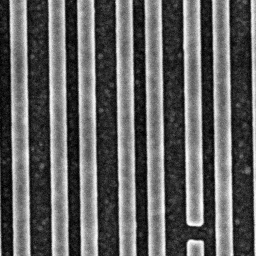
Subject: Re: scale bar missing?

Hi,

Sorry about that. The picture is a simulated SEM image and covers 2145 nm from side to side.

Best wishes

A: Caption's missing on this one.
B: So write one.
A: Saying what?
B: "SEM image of parallel lines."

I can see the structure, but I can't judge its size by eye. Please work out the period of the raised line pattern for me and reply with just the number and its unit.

283 nm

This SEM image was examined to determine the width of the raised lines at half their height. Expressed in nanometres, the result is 134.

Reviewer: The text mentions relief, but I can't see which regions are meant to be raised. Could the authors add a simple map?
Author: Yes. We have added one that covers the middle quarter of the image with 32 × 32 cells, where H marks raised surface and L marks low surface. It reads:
LLLLHHHHLLLLLHHHHLLLLHHHLLLLLLHH
LLLLHHHLLLLLLHHHHLLLLHHHHLLLLLHH
LLLLHHHHLLLLLHHHHLLLLHHHLLLLLLHH
LLLLHHHHLLLLLHHHHLLLLHHHHLLLLLHH
LLLLHHHHLLLLLHHHHLLLLHHHHLLLLLHH
LLLLHHHHLLLLLLHHHLLLLHHHHLLLLLHH
LLLLHHHHLLLLLLHHHLLLLHHHHLLLLLHH
LLLLHHHHLLLLLLHHHLLLLHHHHLLLLLHH
LLLLHHHHLLLLLLHHHLLLLHHHLLLLLLHH
LLLLHHHHLLLLLLHHHLLLLHHHHLLLLLHH
LLLLHHHHLLLLLLHHHLLLLHHHLLLLLLHH
LLLLHHHHLLLLLLHHHLLLLHHHLLLLLLHH
LLLLHHHHLLLLLLHHHLLLLHHHLLLLLLLH
HLLLHHHHLLLLLHHHHLLLLHHHHLLLLLLH
HLLLHHHHLLLLLLHHHLLLLHHHHLLLLLLH
HLLLHHHHLLLLLLHHHLLLLHHHHLLLLLLH
HLLLHHHHLLLLLLHHHLLLLHHHHLLLLLLH
HLLLHHHHLLLLLHHHHLLLLHHHHLLLLLLH
HLLLHHHHLLLLLLHHHLLLLHHHHLLLLLLH
HLLLHHHHLLLLLLHHHLLLLHHHHLLLLLLH
HLLLHHHHLLLLLLHHHHLLLHHHHLLLLLLH
HLLLHHHHLLLLLLHHHHLLLHHHHLLLLLLH
HLLLHHHHLLLLLLHHHHLLLHHHHLLLLLLH
HLLLHHHHLLLLLLHHHHLLLHHHHLLLLLLH
HLLLHHHHLLLLLLHHHHLLLHHHHLLLLLLH
HLLLHHHHLLLLLLHHHHLLLHHHHLLLLLLH
HLLLHHHHLLLLLLHHHHLLLHHHHLLLLLLH
HLLLHHHHLLLLLLHHHHLLLHHHHLLLLLLH
HLLLHHHHLLLLLLHHHHLLLHHHHLLLLLLH
HLLLHHHHLLLLLLHHHHLLLHHHHLLLLLLH
HLLLHHHHLLLLLLHHHHLLLHHHHLLLLLLH
HLLLHHHHLLLLLLHHHHLLLHHHHLLLLLLH